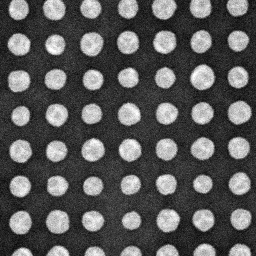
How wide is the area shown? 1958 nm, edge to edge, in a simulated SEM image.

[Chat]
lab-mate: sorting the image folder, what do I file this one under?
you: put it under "a regular array of raised bodies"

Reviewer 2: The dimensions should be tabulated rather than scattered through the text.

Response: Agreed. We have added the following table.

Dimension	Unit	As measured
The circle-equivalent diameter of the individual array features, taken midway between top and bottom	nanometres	160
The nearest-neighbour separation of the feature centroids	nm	270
